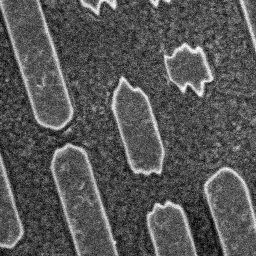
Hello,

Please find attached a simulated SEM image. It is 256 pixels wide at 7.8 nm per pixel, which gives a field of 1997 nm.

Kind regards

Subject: one or a few lines or trenches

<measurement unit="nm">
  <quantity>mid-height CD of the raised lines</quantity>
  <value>291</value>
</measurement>